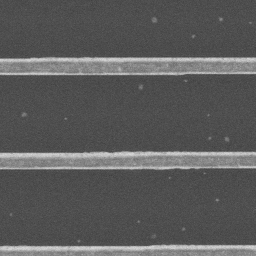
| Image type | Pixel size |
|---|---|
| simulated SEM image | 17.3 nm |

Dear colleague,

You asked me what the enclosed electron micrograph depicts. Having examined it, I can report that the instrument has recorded lines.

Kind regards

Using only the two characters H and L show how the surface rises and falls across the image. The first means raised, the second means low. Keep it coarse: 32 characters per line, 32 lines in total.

LLLLLLLLLLLLLLLLLLLLLLLLLLLLLLLL
LLLLLLLLLLLLLLLLLLLLLLLLLLLLLLLL
LLLLLLLLLLLLLLLLLLLLLLLLLLLLLLLL
LLLLLLLLLLLLLLLLLLLLLLLLLLLLLLLL
LLLLLLLLLLLLLLLLLLLLLLLLLLLLLLLL
LLLLLLLLLLLLLLLLLLLLLLLLLLLLLLLL
LLLLLLLLLLLLLLLLLLLLLLLLLLLLLLLL
HHHHHHHHHHHHHHHHHHHHHHHHHHHHHHHH
HHHHHHHHHHHHHHHHHHHHHHHHHHHHHHHH
LLLLLLLLLLLLLLLLLLLLLLLLLLLLLLLL
LLLLLLLLLLLLLLLLLLLLLLLLLLLLLLLL
LLLLLLLLLLLLLLLLLLLLLLLLLLLLLLLL
LLLLLLLLLLLLLLLLLLLLLLLLLLLLLLLL
LLLLLLLLLLLLLLLLLLLLLLLLLLLLLLLL
LLLLLLLLLLLLLLLLLLLLLLLLLLLLLLLL
LLLLLLLLLLLLLLLLLLLLLLLLLLLLLLLL
LLLLLLLLLLLLLLLLLLLLLLLLLLLLLLLL
LLLLLLLLLLLLLLLLLLLLLLLLLLLLLLLL
LLLLLLLLLLLLLLLLLLLLLLLLLLLLLLLL
HHHHHHHHHHHHHHHHHHHHHHHHHHHHHHHH
HHHHHHHHHHHHHHHHHHHHHHHHHHHHHHHH
LLLLLLLLLLLLLLLLLLLLLLLLLLLLLLLL
LLLLLLLLLLLLLLLLLLLLLLLLLLLLLLLL
LLLLLLLLLLLLLLLLLLLLLLLLLLLLLLLL
LLLLLLLLLLLLLLLLLLLLLLLLLLLLLLLL
LLLLLLLLLLLLLLLLLLLLLLLLLLLLLLLL
LLLLLLLLLLLLLLLLLLLLLLLLLLLLLLLL
LLLLLLLLLLLLLLLLLLLLLLLLLLLLLLLL
LLLLLLLLLLLLLLLLLLLLLLLLLLLLLLLL
LLLLLLLLLLLLLLLLLLLLLLLLLLLLLLLL
LLLLLLLLLLLLLLLLLLLLLLLLLLLLLLLL
HHHHHHHHHHHHHHHHHHHHHHHHHHHHHHHH